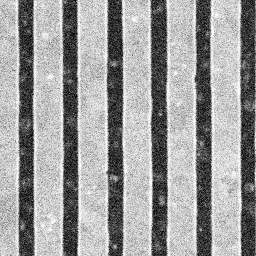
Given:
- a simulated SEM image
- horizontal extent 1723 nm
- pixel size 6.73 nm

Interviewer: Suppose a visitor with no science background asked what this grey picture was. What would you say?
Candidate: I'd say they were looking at parallel lines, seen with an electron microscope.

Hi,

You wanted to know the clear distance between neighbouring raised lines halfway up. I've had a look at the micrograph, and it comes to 114 nanometres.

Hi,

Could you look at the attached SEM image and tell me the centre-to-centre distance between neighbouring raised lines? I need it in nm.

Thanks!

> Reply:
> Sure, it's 299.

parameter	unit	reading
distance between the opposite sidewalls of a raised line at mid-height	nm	184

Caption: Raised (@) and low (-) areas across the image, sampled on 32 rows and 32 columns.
@@--@@@@--@@@--@@@@--@@@---@@@--
@@--@@@@--@@@--@@@@--@@@---@@@--
@@--@@@@--@@@--@@@@--@@@---@@@--
@@--@@@@--@@@--@@@@--@@@---@@@--
@@--@@@@--@@@--@@@@--@@@--@@@@--
@@--@@@@--@@@--@@@@--@@@--@@@@--
@@--@@@@--@@@---@@@--@@@--@@@@--
@@--@@@@--@@@--@@@@--@@@--@@@@--
@@--@@@@--@@@--@@@@--@@@--@@@@--
@@--@@@@--@@@--@@@@--@@@--@@@@--
@@--@@@@--@@@--@@@@--@@@--@@@@--
@@--@@@@--@@@--@@@@--@@@---@@@--
@@--@@@@--@@@---@@@--@@@---@@@--
@@--@@@@--@@@--@@@@--@@@---@@@--
@@--@@@@--@@@--@@@@--@@@---@@@--
@@--@@@@--@@@---@@@--@@@---@@@--
@@--@@@@--@@@---@@@--@@@---@@@--
@@--@@@@--@@@---@@@--@@@---@@@--
@@--@@@@--@@@---@@@--@@@---@@@--
@@--@@@@--@@@---@@@--@@@---@@@--
@@--@@@@--@@@---@@@--@@@---@@@--
@@--@@@@--@@@---@@@--@@@---@@@--
@@--@@@@--@@@@--@@@--@@@---@@@--
@@--@@@@--@@@---@@@--@@@---@@@--
@@--@@@@--@@@---@@@--@@@---@@@--
@@--@@@@--@@@---@@@--@@@---@@@--
@@--@@@@--@@@---@@@--@@@---@@@--
@@--@@@@--@@@---@@@--@@@---@@@--
@@--@@@@--@@@---@@@--@@@---@@@--
@@--@@@@--@@@@--@@@--@@@---@@@--
@@--@@@@--@@@@--@@@--@@@---@@@--
@@--@@@@--@@@---@@@--@@@---@@@--